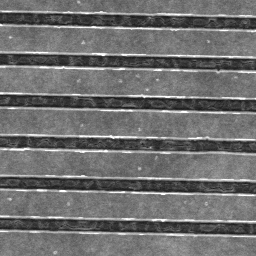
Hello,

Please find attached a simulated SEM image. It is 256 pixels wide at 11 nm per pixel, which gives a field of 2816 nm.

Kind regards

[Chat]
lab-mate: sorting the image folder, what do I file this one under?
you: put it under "parallel lines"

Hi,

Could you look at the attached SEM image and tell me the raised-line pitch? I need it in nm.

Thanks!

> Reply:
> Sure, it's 452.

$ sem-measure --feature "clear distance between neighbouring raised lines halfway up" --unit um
0.139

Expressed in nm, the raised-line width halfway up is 316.